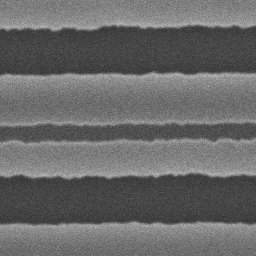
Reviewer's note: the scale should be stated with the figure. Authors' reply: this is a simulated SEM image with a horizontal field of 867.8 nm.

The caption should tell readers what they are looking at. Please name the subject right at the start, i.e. lines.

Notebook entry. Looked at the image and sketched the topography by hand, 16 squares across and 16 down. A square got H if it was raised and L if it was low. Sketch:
HHHHHHHHHHHHHHHH
HHHHHHHHHHHHHHHH
LLLLLLLLLLLLLLLL
LLLLLLLLLLLLLLLL
LLLLLLLLLLLLLLLL
HHHHHHHHHHHHHHHH
HHHHHHHHHHHHHHHH
HHHHHHHHHHHHHHHH
HHHHHHHHHHHHHHHH
HHHHHHHHHHHHHHHH
HHHHHHHHHHHHHHHH
LLLLLLLLLLLLLLLL
LLLLLLLLLLLLLLLL
LLLLLLLLLLLLLLLL
HHHHHHHHHHHHHHHH
HHHHHHHHHHHHHHHH